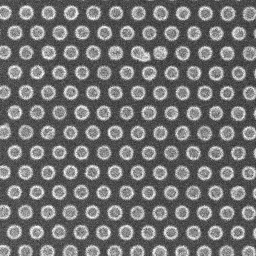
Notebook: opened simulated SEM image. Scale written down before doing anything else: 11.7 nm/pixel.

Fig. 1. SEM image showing a regular array of raised bodies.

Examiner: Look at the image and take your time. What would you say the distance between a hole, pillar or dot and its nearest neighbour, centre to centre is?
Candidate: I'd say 260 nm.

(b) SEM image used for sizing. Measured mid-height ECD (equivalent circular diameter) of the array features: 146 nm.